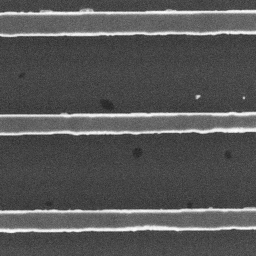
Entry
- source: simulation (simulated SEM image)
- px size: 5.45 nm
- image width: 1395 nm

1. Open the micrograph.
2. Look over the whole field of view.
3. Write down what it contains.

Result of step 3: lines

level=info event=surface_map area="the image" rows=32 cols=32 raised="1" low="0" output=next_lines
00000000000000000000000000000000
00000000000000000000000001111111
11111111111111111111111111111111
11111111111111111111111111111111
11000000000000000000000000000000
00000000000000000000000000000000
00000000000000000000000000000000
00000000000000000000000000000000
00000000000000000000000000000000
00000000000000000000000000000000
00000000000000000000000000000000
00000000000000000000000000000000
00000000000000000000000000000000
00000000000000000000000000000000
11111111111111111111111111111111
11111111111111111111111111111111
11111111111111111111111111100000
00000000000000000000000000000000
00000000000000000000000000000000
00000000000000000000000000000000
00000000000000000000000000000000
00000000000000000000000000000000
00000000000000000000000000000000
00000000000000000000000000000000
00000000000000000000000000000000
00000000000000000000000000000000
11111111111111111111111111111111
11111111111111111111111111111111
11111111111111111111111111111111
00000000000000000000000000000000
00000000000000000000000000000000
00000000000000000000000000000000